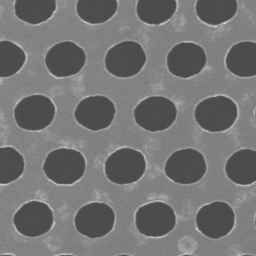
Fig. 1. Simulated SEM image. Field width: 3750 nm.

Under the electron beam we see a regular array of holes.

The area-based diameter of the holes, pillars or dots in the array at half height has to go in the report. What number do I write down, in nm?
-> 560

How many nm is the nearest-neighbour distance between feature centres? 886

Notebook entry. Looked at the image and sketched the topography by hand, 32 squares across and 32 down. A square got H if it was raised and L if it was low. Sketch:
HHLLLLLHHHLLLLLHHLLLLLHHHLLLLLHH
HHLLLLLHHHLLLLHHHLLLLLHHHLLLLHHH
HHHLLLHHHHLLLHHHHHLLLHHHHLLLLHHH
HHHHHHHHHHHHHHHHHHHHHHHHHHHHHHHH
HHHHHHHHHHHHHHHHHHHHHHHHHHHHHHHH
LLHHHHHLLHHHHHHLLHHHHHLLLHHHHLLL
LLLHHHLLLLHHHLLLLLHHHLLLLLHHHLLL
LLLHHHLLLLLHHLLLLLHHHLLLLLHHLLLL
LLLHHHLLLLHHHLLLLLHHHLLLLHHHHLLL
LHHHHHHLLHHHHHLLLHHHHHLLHHHHHHLH
HHHHHHHHHHHHHHHHHHHHHHHHHHHHHHHH
HHHHHHHHHHHHHHHHHHHHHHHHHHHHHHHH
HHHLLLHHHHLLLLHHHHLLLHHHHLLLLHHH
HHLLLLLHHHLLLLHHHLLLLLHHHLLLLLHH
HHLLLLLHHLLLLLHHHLLLLLHHLLLLLLHH
HHLLLLHHHHLLLLHHHLLLLHHHHLLLLHHH
HHHHHHHHHHHHHHHHHHHHHHHHHHHHHHHH
HHHHHHHHHHHHHHHHHHHHHHHHHHHHHHHH
LHHHHHHHHHHHHHHHHHHHHHHHHHHHHHHH
LLLHHHLLLLHHHHLLLLHHHLLLLHHHHLLL
LLLHHHLLLLLHHLLLLLHHHLLLLLHHLLLL
LLLHHHLLLLLHHLLLLLHHHLLLLLHHLLLL
LLHHHHLLLLHHHHLLLHHHHHLLLHHHHLLL
HHHHHHHHHHHHHHHHHHHHHHHHHHHHHHHH
HHHHHHHHHHHHHHHHHHHHHHHHHHHHHHHH
HHHLLLHHHHHLLHHHHHLLLHHHHHLLHHHH
HHLLLLHHHHLLLLHHHLLLLLHHHLLLLHHH
HHLLLLLHHLLLLLHHHLLLLLHHHLLLLHHH
HHLLLLHHHHLLLLHHHLLLLLHHHLLLLHHH
HHHLLHHHHHHLLHHHHHHLHHHHHHLLHHHH
HHHHHHHHHHHHHHHHHHHHHHHHHHHHHHHH
HHHHHHHHHHHHHHHHHHHHHHHHHHHHHHHH